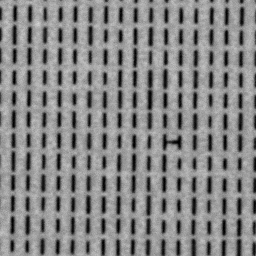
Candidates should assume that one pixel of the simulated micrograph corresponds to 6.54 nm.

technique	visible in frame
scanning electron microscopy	a regular array of holes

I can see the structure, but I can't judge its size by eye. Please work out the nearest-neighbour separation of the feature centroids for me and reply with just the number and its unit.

98 nanometres